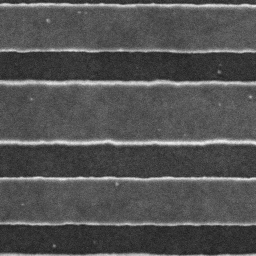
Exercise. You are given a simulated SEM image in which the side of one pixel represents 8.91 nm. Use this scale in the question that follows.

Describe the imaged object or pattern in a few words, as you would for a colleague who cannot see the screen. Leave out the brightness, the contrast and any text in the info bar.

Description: lines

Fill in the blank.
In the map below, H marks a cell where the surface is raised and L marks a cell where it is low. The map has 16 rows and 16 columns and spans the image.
HHHHHHHHHHHHHHHH
HHHHHHHHHHHHHHHH
HHHHHHHHHHHHHHHH
LLLLLLLLLLLLLLLL
LLLLLLLLLLLLLLLL
HHHHHHHHHHHHHHHH
HHHHHHHHHHHHHHHH
HHHHHHHHHHHHHHHH
HHHHHHHHHHHHHHHH
LLLLLLLLLLLLLLLL
LLLLLLLLLLLLLLLL
HHHHHHHHHHHHHHHH
HHHHHHHHHHHHHHHH
HHHHHHHHHHHHHHHH
LLLLLLLLLLLLLLLL
LLLLLLLLLLLLLLLL